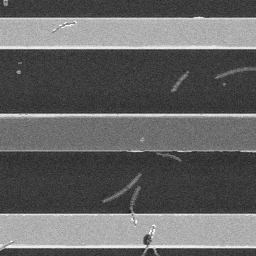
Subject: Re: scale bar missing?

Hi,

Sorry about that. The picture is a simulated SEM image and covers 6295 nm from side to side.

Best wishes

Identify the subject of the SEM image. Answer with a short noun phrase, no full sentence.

lines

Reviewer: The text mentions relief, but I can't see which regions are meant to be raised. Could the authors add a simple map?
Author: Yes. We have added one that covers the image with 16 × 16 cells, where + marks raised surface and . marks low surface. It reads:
................
++++++++++++++++
++++++++++++++++
................
................
................
................
++++++++++++++++
++++++++++++++++
................
................
................
................
++++++++++++++++
++++++++++++++++
+........+......